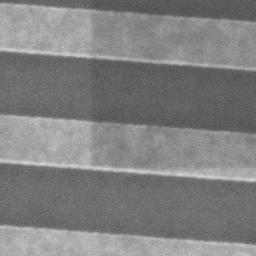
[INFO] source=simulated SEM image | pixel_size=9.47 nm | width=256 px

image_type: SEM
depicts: lines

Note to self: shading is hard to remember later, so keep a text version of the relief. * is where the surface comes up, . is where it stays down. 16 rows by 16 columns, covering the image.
****............
****************
****************
.....***********
................
................
................
****............
****************
****************
.....***********
................
................
................
*****...........
****************